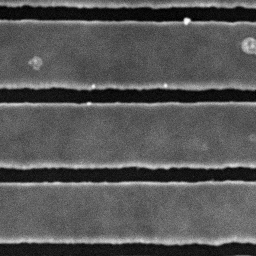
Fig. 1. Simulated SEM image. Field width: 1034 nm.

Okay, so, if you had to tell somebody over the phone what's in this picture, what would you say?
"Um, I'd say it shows lines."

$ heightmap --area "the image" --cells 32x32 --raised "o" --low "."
oooooooooooooooooooooooooooooooo
................................
.......................o........
oooooooooooooooooooooooooooooooo
oooooooooooooooooooooooooooooooo
oooooooooooooooooooooooooooooooo
oooooooooooooooooooooooooooooooo
oooooooooooooooooooooooooooooooo
oooooooooooooooooooooooooooooooo
oooooooooooooooooooooooooooooooo
oooooooooooooooooooooooooooooooo
................................
................................
oooooooooooooooooooooooooooooooo
oooooooooooooooooooooooooooooooo
oooooooooooooooooooooooooooooooo
oooooooooooooooooooooooooooooooo
oooooooooooooooooooooooooooooooo
oooooooooooooooooooooooooooooooo
oooooooooooooooooooooooooooooooo
oooooooooooooooooooooooooooooooo
................................
................................
oooooooooooooooooooooooooooooooo
oooooooooooooooooooooooooooooooo
oooooooooooooooooooooooooooooooo
oooooooooooooooooooooooooooooooo
oooooooooooooooooooooooooooooooo
oooooooooooooooooooooooooooooooo
oooooooooooooooooooooooooooooooo
....................ooo...oo....
................................